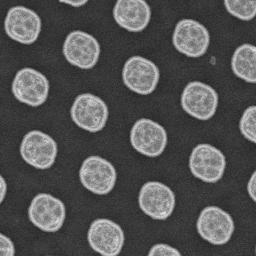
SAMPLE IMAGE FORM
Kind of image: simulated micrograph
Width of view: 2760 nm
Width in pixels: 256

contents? a regular array of raised bodies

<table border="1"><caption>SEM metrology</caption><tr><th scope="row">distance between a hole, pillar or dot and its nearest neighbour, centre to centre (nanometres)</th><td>678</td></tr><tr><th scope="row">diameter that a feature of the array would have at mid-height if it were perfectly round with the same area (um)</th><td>0.373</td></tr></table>